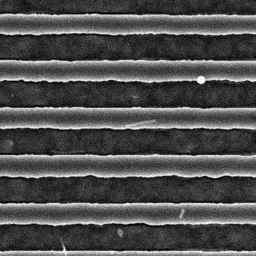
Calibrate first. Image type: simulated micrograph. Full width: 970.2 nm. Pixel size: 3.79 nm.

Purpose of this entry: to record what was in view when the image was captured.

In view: lines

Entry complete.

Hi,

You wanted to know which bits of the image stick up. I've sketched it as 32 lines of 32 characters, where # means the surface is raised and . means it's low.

................................
................................
################################
################################
................................
................................
................................
................................
################################
################################
................................
................................
................................
##..#######.....##....##........
################################
################################
................................
................................
................................
##############################.#
################################
################################
................................
................................
................................
.############..#############.###
################################
################################
................................
................................
................................
##########################.#####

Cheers